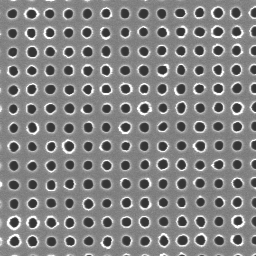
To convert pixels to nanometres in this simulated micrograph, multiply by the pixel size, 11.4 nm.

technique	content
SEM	a regular array of holes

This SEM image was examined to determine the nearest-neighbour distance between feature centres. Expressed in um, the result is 0.21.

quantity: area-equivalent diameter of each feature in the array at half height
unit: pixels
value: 8.81